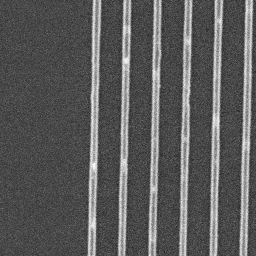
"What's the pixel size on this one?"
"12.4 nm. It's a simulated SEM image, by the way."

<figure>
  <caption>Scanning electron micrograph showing parallel lines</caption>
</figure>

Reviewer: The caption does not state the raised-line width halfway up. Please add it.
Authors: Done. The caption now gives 83.9 nm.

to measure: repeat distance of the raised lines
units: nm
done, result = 378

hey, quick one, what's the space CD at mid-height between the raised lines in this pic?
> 295 nanometres